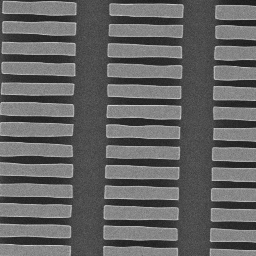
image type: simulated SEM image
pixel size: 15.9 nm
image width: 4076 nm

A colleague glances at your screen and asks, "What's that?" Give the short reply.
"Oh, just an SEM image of groups of lines, slits or small figures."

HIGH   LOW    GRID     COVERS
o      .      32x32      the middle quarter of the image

ooo........oooooooooooo...ooo...
ooo........oooooooooooooooooo...
ooo........oooooooooooooooooo...
...........................oo...
................................
ooo........ooooooooooooo........
oo.........oooooooooooooooooo...
oo.........oooooooooooooooooo...
..........................ooo...
................................
oo.........ooooooooooooooo......
ooo........oooooooooooooooooo...
ooo........oooooooooooooooooo...
............oo.....oooooooooo...
................................
oo.........ooooo....ooooo.......
oo.........oooooooooooooooooo...
oo.........oooooooooooooooooo...
....................ooooooooo...
................................
oo..............................
oo.........oooooooooooooooooo...
oo.........oooooooooooooooooo...
............ooooooooooooooooo...
................................
oo.........oooooo...............
oo........ooooooooooooooooooo...
oo........ooooooooooooooooooo...
...........oooooooooooooooooo...
................................
oo..............................
oo........oooooooooooooooooo....